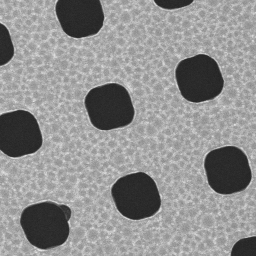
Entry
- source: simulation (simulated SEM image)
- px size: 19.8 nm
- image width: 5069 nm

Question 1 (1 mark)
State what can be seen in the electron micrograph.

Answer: holes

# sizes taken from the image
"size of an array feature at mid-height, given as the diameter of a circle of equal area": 957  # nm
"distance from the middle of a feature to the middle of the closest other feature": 1.86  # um